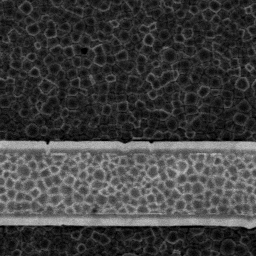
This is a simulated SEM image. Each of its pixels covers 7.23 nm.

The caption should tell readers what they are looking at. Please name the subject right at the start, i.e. one or a few lines or trenches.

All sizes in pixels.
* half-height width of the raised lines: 76.6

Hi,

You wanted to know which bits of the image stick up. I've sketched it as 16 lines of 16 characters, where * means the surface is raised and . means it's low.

................
................
................
................
................
................
................
................
................
****************
****************
****************
****************
****************
................
................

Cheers